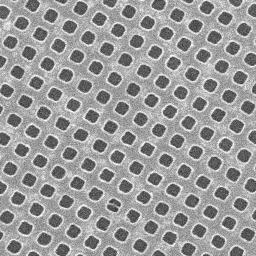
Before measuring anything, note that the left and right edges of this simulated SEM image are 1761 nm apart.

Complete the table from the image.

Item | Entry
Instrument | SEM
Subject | a regular array of holes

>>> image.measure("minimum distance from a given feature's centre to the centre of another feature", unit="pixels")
21.4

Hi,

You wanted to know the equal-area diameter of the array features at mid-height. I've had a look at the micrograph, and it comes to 94.7 nm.